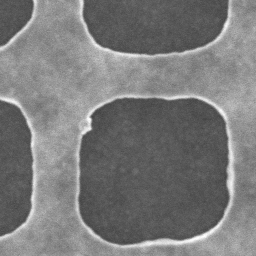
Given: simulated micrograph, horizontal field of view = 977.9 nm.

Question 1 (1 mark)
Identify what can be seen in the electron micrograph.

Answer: holes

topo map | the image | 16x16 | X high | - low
--XXX---------XX
--XXX---------XX
-XXXXX-------XXX
XXXXXXXXXXXXXXXX
XXXXXXXXXXXXXXXX
XXXXXXXXXXXXXXXX
-XXXXXX------XXX
--XXXX--------XX
--XXX---------XX
--XXX---------XX
--XXX---------XX
--XXX---------XX
--XXX---------XX
--XXX---------XX
-XXXXX-------XXX
XXXXXXXXXXXXXXXX